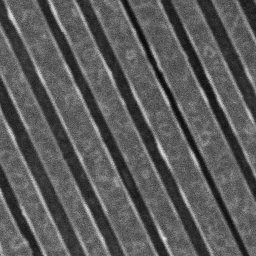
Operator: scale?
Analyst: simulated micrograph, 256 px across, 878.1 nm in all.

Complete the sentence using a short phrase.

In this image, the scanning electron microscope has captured parallel lines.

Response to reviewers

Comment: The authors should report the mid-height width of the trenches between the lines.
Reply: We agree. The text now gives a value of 11.4 pixels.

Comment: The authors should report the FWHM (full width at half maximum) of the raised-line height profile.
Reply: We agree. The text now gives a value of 92.4 nm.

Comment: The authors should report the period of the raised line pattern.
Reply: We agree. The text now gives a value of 129 nanometres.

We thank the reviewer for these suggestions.